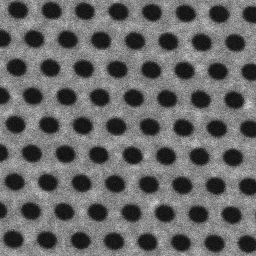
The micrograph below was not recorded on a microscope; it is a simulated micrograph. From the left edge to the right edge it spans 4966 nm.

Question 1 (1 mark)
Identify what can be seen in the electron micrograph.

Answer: a regular array of holes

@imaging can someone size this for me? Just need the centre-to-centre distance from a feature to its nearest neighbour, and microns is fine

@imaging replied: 0.637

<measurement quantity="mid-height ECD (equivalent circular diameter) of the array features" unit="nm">378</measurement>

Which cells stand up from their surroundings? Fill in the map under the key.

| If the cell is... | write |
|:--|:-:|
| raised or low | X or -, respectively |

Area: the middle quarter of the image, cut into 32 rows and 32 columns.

XX-----XXXX-----XXX-----XXXX----
XX------XXX-----XXX-----XXX-----
XXX----XXXX-----XXX-----XXXX----
XXXXX-XXXXXXX--XXXXXX--XXXXXX---
XXXXXXXXXXXXXXXXXXXXXXXXXXXXXXXX
XXXXXXXXXXXXXXXXXXXXXXXXXXXXXXXX
--XXXXX---XXXXXX--XXXXXXX-XXXXXX
---XXX-----XXXX-----XXX-----XXXX
---XXX------XXX-----XXX-----XXXX
---XXXX----XXXX-----XXXX----XXXX
XXXXXXXX--XXXXXX---XXXXX----XXXX
XXXXXXXXXXXXXXXXXXXXXXXXXXXXXXXX
XXXXXXXXXXXXXXXXXXXXXXXXXXXXXXXX
XXX---XXXXXX--XXXXXXXXXXXXXXXXXX
XX-----XXXX----XXXX----XXXX----X
XX-----XXX------XXX-----XXX-----
XXX----XXXX-----XXX-----XXX-----
XXXX--XXXXXX---XXXXX---XXXXX----
XXXXXXXXXXXXXXXXXXXXXXXXXXXXXXXX
XXXXXXXXXXXXXXXXXXXXXXXXXXXXXXXX
-XXXXXXX-XXXXXXXXXXXXXXXXXXXXXXX
---XXX-----XXXX----XXXX----XXXXX
---XXX-----XXXX-----XXX-----XXX-
---XXX-----XXXX-----XXX-----XXX-
--XXXXX----XXXXX---XXXXX----XXXX
XXXXXXXXXXXXXXXXXXXXXXXXXXXXXXXX
XXXXXXXXXXXXXXXXXXXXXXXXXXXXXXXX
XXXX-XXXXXXXXXXXXXXXXXXXXXXXXXXX
XX----XXXXX----XXXX----XXXXX---X
XX-----XXX-----XXXX-----XXX-----
XX-----XXX-----XXXX-----XXX-----
XXX---XXXXX----XXXX-----XXX-----